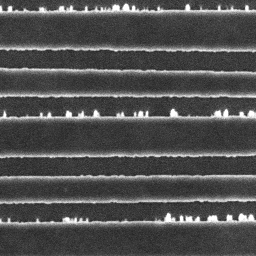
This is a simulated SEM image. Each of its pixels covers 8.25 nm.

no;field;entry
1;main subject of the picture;lines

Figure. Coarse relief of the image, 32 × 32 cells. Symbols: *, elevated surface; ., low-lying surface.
................................
********************************
********************************
********************************
********************************
********************************
................................
................................
................................
********************************
********************************
********************************
................................
................................
........*..*.....*...*.....**..*
********************************
********************************
********************************
********************************
***************************.**..
................................
................................
********************************
********************************
********************************
................................
................................
....................****..*.*.**
********************************
********************************
********************************
********************************